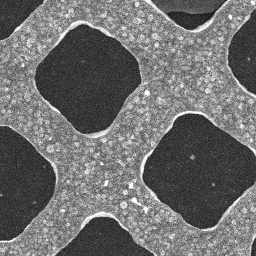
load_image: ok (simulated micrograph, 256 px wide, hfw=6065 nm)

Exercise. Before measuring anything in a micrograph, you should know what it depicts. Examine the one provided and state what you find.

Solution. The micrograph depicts holes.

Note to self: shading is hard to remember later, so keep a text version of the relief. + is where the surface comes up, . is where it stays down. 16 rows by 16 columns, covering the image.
..++++++++....++
.++++++++++..++.
++++...+++++++..
+++.....++++++..
++.......+++++..
++.......++++++.
+++.....++++++++
++++...++++..+++
.+++++++++....++
..++++++++......
...++++++.......
...++++++.......
...+++++++.....+
..++++.++++...++
.++++...++++++++
++++.....+++++++